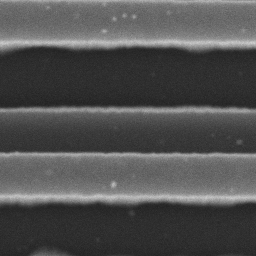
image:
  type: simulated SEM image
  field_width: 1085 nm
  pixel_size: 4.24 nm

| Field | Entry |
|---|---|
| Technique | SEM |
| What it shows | lines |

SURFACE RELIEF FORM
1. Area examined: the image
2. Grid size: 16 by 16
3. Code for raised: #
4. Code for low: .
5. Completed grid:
################
################
################
................
................
................
................
################
################
################
################
################
................
................
................
................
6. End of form